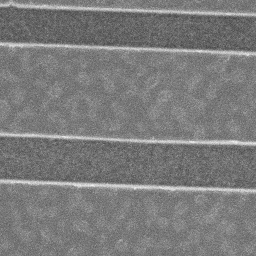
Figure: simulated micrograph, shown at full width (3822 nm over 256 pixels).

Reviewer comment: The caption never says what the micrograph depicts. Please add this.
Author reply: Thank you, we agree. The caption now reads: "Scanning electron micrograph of one or a few lines or trenches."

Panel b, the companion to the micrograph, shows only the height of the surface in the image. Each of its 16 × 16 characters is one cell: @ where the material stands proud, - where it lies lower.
----@@@@@@@@@@@@
----------------
----------------
@@@@@@@@@@@@@@@@
@@@@@@@@@@@@@@@@
@@@@@@@@@@@@@@@@
@@@@@@@@@@@@@@@@
@@@@@@@@@@@@@@@@
---@@@@@@@@@@@@@
----------------
----------------
@@@@------------
@@@@@@@@@@@@@@@@
@@@@@@@@@@@@@@@@
@@@@@@@@@@@@@@@@
@@@@@@@@@@@@@@@@